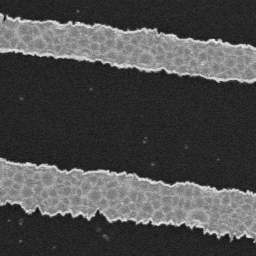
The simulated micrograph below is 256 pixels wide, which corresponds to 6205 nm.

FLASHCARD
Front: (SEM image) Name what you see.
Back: one or a few lines or trenches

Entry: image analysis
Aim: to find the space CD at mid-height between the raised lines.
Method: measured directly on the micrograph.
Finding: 2670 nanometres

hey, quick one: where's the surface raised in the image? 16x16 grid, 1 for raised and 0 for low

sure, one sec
0000000000000000
1111000000000000
1111111111110000
0001111111111111
0000000000011111
0000000000000000
0000000000000000
0000000000000000
0000000000000000
0000000000000000
1110000000000000
1111111111010000
1111111111111111
0000000111111111
0000000000000111
0000000000000000